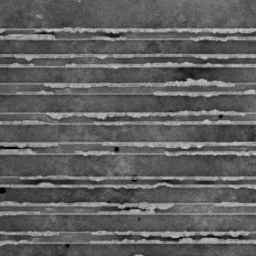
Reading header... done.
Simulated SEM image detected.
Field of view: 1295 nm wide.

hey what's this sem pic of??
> parallel lines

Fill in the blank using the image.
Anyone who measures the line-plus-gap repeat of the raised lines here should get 148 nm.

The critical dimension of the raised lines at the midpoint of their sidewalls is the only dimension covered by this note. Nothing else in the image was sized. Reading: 60.1 nanometers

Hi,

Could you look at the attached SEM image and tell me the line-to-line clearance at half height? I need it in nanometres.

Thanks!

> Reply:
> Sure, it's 85.4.